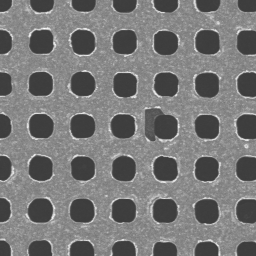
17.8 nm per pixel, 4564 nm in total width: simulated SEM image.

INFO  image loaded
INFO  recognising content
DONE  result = a regular array of holes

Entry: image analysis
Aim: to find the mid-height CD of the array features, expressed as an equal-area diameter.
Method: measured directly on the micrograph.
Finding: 0.453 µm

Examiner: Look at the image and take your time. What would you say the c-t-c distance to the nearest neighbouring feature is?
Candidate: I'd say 738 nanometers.